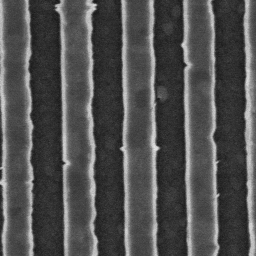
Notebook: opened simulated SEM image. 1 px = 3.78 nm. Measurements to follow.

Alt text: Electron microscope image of one or a few lines or trenches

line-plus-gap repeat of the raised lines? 61.5 px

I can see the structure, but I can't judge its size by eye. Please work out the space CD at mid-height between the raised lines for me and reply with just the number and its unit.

130 nm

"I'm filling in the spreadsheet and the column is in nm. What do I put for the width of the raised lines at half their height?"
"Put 104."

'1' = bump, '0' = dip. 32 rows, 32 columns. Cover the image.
11100001111000011110000111000001
11100001111000011110000111000001
11110000111000011110000111100001
11110000111000011110000111100001
11110000111000001110000111100001
11110000111000001110000111100001
11110000111000011110000111100001
11100000111000001110000111100001
11100000111000001110000111100001
11100000111000001110000111100001
11100000111000001110000111100001
11110000111000001110000111100001
11110000111000001110000111100001
11110000111000001110000111100001
11110000111000001110000111100001
11110000111000001110000111100001
11110000111000001110000111100001
11110000111100001110000111000001
01110000111100011110000011100001
01110000111100001110000011100001
11110000111000001110000011100001
11110000111000001110000111100001
11110000111000001110000111100001
01110000111100001110000111100001
01110000111100001110000011100001
01110000111100001110000011100001
01110000111100001110000011100001
01110000111100001110000011100001
01110000111000001110000011100001
11110000111100001110000011100001
11110000111100001110000011100000
01110000111100001110000011100001